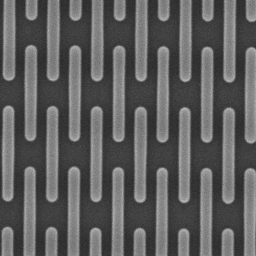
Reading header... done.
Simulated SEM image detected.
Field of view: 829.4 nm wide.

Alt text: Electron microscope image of groups of lines, slits or small figures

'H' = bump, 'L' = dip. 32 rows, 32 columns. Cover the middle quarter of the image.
LLHHLLLHHHLLLHHLLLHHHLLLHHLLLHHH
LLHHLLLHHHLLLHHLLLHHHLLLHHLLLHHH
LLHHLLLHHHLLLHHLLLHHHLLLHHLLLHHH
LLHHLLLHHLLLLHHLLLHHLLLLHHLLLHHH
LLHHLLLLLLLLLHHLLLLLLLLLHHLLLLLL
LLHHLLLLLLLLLHHLLLLLLLLLHHLLLLLL
LLHHLLLLLLLLLHHLLLLLLLLLHHLLLLLL
LLHHLLLLLLLLLHHLLLLLLLLLHHLLLLLL
LLHHLLLLLLLLLHHLLLLLLLLLHHLLLLLL
LLHHLLLLLLLLLHHLLLLLLLLLHHLLLLLL
LLHHLLLLLLLLLHHLLLLLLLLLHHLLLLLL
LLHHLLLHHLLLLHHLLLHHLLLLHHLLLHHL
LLHHLLLHHLLLLHHLLLHHHLLLHHLLLHHL
LLHHLLLHHLLLLHHLLLHHHLLLHHLLLHHL
LLHHLLLHHLLLHHHLLLHHHLLLHHLLLHHL
LLHHLLLHHLLLHHHLLLHHHLLHHHLLLHHL
LLHHLLLHHLLLHHHLLLHHHLLHHHLLLHHL
LLHHLLLHHLLLHHHLLLHHHLLHHHLLLHHL
LLHHLLLHHLLLLHHLLLHHHLLHHHLLLHHL
LLLLLLLHHLLLLLLLLLHHHLLLLLLLLHHL
LLLLLLLHHLLLLLLLLLHHLLLLLLLLLHHL
LLLLLLLHHLLLLLLLLLHHLLLLLLLLLHHL
LLLLLLLHHLLLLLLLLLHHLLLLLLLLLHHL
LLLLLLLHHLLLLLLLLLHHLLLLLLLLLHHL
LLLLLLLHHLLLLLLLLLHHLLLLLLLLLHHL
LLLLLLLHHLLLLLLLLLHHLLLLLLLLLHHL
LHHHLLLHHLLLLHHLLLHHLLLLHLLLLHHL
LHHHLLLHHLLLHHHLLLHHLLLHHHLLLHHL
LHHHLLLHHLLLHHHLLLHHLLLHHHLLLHHL
LHHHLLLHHLLLHHHLLLHHLLLHHHLLLHHL
LHHHLLLHHLLLHHHLLLHHLLLHHHLLLHHL
LHHHLLLHHLLLHHHLLLHHLLLHHHLLLHHL